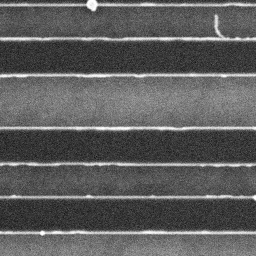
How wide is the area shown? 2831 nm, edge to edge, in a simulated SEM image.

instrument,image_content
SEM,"lines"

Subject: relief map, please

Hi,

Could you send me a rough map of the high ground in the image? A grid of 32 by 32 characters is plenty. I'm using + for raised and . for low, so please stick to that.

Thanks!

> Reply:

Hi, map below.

++++++++++++++++++++++++++++++++
................................
................................
................................
................................
++++++++++++++++++++++++++++++++
++++++++++++++++++++++++++++++++
++++++++++++++++++++++++++++++++
++++++++++++++++++++++++++++++++
++++.....+++++...+.........++...
................................
................................
................................
................................
................................
................................
++++++++++++++++++++++++++++++++
++++++++++++++++++++++++++++++++
++++++++++++++++++++++++++++++++
++++++++++++++++++++++++++++++++
++++++++..++++++++++++++++++++++
................................
................................
................................
................................
++++++++++++++++++++++++++++++++
++++++++++++++++++++++++++++++++
++++++++++++++++++++++++++++++++
++++++++++++++++++++++++++++++++
................................
................................
................................